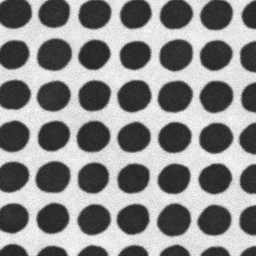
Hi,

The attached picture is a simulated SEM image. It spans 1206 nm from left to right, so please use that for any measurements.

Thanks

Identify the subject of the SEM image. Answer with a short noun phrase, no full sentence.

a regular array of holes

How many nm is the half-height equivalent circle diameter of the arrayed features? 151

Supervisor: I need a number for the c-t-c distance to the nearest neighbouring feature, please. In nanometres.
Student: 189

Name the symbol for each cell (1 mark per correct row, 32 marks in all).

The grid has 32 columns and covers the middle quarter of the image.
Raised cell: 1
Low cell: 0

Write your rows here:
11111000001111100000111110000001
11111100111111111011111111000011
11111111111111111111111111111111
11111111111111111111111111111111
11111100001111110000111111000011
01110000000111000000011110000001
01110000000011000000001100000000
00100000000010000000001000000000
00110000000110000000001000000000
01110000000111000000001000000000
11110000000111000000011100000001
11111000011111100000111110000011
11111111111111111111111111111111
11111111111111111111111111111111
11111100011111111111111111100111
01110000001111100000111110000001
01110000000111000000011100000001
00100000000010000000001100000000
01100000000010000000001000000000
01100000000110000000011100000000
11110000000111000000011100000001
11111000011111100000111110000011
11111111111111111111111111111111
11111111111111111111111111111111
11111111111111111111111111111111
01111000001111100000111111000011
01110000000111000000011110000001
00100000000111000000011100000000
00100000000110000000011000000000
01100000000110000000011000000001
01110000000111000000011100000001
11110000001111000000111100000011